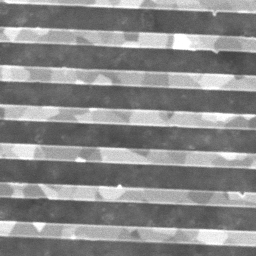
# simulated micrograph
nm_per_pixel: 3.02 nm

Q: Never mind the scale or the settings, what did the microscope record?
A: parallel lines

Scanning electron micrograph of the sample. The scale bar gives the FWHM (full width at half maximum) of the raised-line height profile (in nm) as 42.6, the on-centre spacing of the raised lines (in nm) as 117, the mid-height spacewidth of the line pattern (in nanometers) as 74.2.